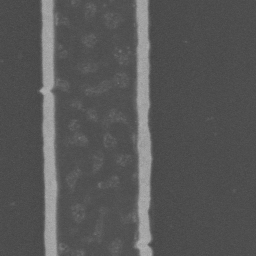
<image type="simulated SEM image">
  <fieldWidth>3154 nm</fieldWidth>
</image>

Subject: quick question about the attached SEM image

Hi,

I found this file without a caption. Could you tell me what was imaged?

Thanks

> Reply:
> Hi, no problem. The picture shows one or a few lines or trenches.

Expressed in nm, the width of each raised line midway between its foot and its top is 1190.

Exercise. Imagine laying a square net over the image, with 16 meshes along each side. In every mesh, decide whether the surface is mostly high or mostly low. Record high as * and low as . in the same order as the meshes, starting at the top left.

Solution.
...******.......
...******.......
...******.......
...******.......
...******.......
...******.......
...******.......
...******.......
...******.......
...******.......
...******.......
...******.......
...******.......
...******.......
...******.......
...******.......